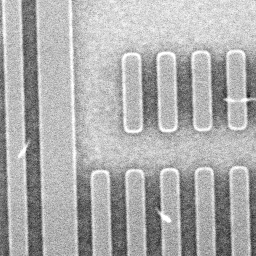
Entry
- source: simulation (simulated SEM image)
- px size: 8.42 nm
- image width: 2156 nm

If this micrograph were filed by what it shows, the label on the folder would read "groups of lines, slits or small figures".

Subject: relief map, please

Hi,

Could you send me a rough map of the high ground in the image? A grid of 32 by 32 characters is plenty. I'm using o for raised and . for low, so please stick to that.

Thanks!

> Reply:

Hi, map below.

ooo..oooo.......................
.oo..oooo.......................
.oo..oooo.......................
.oo..oooo.......................
.oo..oooo.......................
.oo..oooo.......................
.oo..oooo................o...o..
.oo..oooo......ooo..oo..oo..oo..
.oo..oooo......ooo..oo..oo..ooo.
.oo..oooo......ooo..oo..oo..ooo.
.oo..oooo.......oo..oo..oo..ooo.
.oo..oooo.......oo..oo..oo..ooo.
.oo..oooo.......oo..oo..oo..ooo.
.oo..oooo.......oo..oo..oo...oo.
.oo..oooo.......oo..oo..oo...oo.
.oo..oooo.......oo..oo..oo...oo.
.oo..oooo.......................
.oo..oooo.......................
.oo..oooo.......................
.oo..oooo.......................
.oo..oooo.......................
.oo..oooo...o...oo..oo...oo..oo.
.oo..oooo..ooo..oo..oo...oo..oo.
.oo..oooo..ooo..oo..oo...oo..oo.
.oo..oooo..ooo..oo..oo...oo..oo.
.oo..oooo...oo..oo..oo...oo..oo.
.oo..ooooo..oo..oo..oo...oo..oo.
.oo..ooooo..oo..oo..oo...oo..oo.
.oo..ooooo..oo..oo..oo...oo..oo.
.oo..ooooo..oo..oo..oo...oo..oo.
.oo...oooo..oo..oo..ooo..oo..oo.
.oo...oooo..oo..oo..ooo..oo..oo.